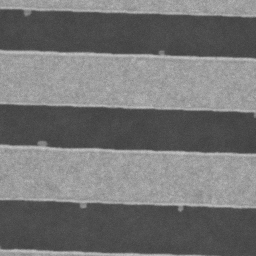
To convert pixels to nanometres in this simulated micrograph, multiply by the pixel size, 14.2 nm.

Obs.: lines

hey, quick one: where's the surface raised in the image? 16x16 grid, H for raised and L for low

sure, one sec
HHHHHHHHHHHHHHHH
LLLLLLLLLLLLLLLL
LLLLLLLLLLLLLLLL
HHHHHHHHHHHLLLLL
HHHHHHHHHHHHHHHH
HHHHHHHHHHHHHHHH
LHHHHHHHHHHHHHHH
LLLLLLLLLLLLLLLL
LLLLLLLLLLLLLLLL
HHHHHHHHHHHHLLLL
HHHHHHHHHHHHHHHH
HHHHHHHHHHHHHHHH
LLHHHHHHHHHHHHHH
LLLLLLLLLLLLLLLL
LLLLLLLLLLLLLLLL
LLLLLLLLLLLLLLLL